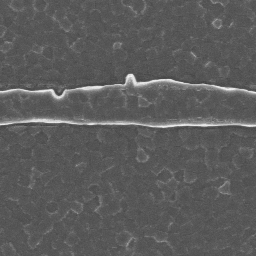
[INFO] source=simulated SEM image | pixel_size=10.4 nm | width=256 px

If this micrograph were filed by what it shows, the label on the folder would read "one or a few lines or trenches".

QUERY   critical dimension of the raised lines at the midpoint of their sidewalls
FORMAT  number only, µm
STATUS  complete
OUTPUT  0.388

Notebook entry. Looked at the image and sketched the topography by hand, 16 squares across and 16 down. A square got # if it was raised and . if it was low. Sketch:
................
................
................
................
................
.....#########..
################
################
................
................
................
................
................
................
................
................